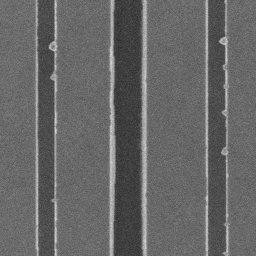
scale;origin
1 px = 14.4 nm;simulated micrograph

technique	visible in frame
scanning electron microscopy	lines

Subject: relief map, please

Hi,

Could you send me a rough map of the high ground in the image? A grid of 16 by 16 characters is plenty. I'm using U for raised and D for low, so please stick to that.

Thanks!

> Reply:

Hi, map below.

UUUUUUUDDUUUUUUU
UUUUUUUDDUUUUUUU
UUUUUUUDDUUUUUUU
UUUUUUUDDUUUUUUU
UUUUUUUDDUUUUUUU
UUUUUUUDDUUUUUUU
UUUUUUUDDUUUUUUU
UUUUUUUDDUUUUUUU
UUUUUUUDDUUUUUUU
UUUUUUUDDUUUUUUU
UUUUUUUDDUUUUUUU
UUUUUUUDDUUUUUUU
UUUUUUUDDUUUUUUU
UUUUUUUDDUUUUUUU
UUUUUUUDDUUUUUUU
UUUUUUUDDUUUUUUU